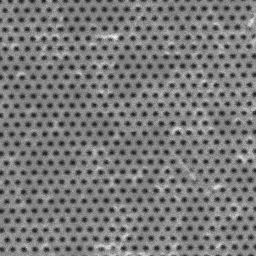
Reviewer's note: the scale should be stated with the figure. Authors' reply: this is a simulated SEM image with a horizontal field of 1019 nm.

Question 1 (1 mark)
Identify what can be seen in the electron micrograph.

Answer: a regular array of holes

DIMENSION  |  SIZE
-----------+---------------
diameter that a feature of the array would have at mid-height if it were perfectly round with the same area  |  23.8 nanometers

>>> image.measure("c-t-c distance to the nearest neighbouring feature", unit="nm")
42.9